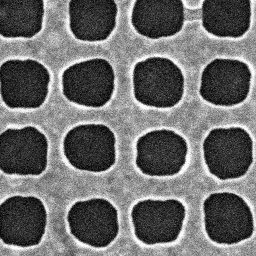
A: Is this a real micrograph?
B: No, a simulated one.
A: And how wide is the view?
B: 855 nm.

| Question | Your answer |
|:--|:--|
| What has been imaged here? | a regular array of holes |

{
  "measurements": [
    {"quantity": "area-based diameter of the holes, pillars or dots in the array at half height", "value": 177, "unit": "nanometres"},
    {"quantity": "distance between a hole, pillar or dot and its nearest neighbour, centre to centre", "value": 0.222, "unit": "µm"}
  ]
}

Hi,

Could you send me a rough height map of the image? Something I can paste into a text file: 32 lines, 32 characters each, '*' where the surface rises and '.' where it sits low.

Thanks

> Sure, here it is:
......***......**......**.......
......***......*...............*
......**.......*........*......*
.....****.....***......**......*
....*****.....****....*****...**
********************************
********************************
*...*******..****....******...**
......**......***......***.....*
......**......**.......**......*
......**......***......**......*
......**......***......**......*
......***.....***......***.....*
*....******.********.***********
********************************
**********..********************
.....***......****....****.....*
......**......***......**.......
......**.......**.......*.......
......**.......**.......*.......
......***.....***......***.....*
.....*************.....***.....*
***************************..***
********************************
*..***********************....**
.....****.....***......**......*
......**.......*.......**......*
......**.......*.......**.......
......***......**......***......
.....****......**.....****.....*
*....*****....****..*******...**
********************************